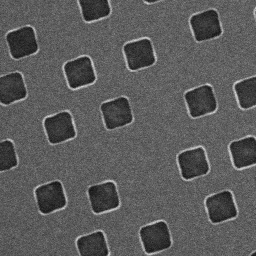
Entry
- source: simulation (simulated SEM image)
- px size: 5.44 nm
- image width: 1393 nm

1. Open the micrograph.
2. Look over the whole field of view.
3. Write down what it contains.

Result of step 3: a regular array of holes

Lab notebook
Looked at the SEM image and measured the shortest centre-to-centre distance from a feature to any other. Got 0.309 µm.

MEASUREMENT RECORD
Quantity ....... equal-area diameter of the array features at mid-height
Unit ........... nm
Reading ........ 172